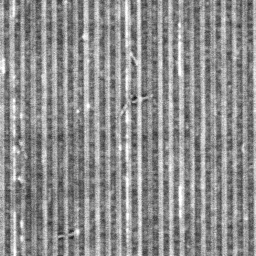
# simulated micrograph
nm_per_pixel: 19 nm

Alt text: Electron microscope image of parallel lines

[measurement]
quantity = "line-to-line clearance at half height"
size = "7.37 px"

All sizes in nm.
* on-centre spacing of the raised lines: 201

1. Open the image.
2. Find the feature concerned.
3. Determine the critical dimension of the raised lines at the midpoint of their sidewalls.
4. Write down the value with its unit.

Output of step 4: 52.4 nanometers